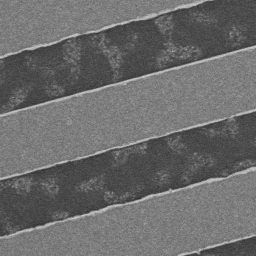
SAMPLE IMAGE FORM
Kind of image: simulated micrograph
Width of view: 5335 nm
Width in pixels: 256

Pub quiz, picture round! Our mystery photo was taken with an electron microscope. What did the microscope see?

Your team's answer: one or a few lines or trenches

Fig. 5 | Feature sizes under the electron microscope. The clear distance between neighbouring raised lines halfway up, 1170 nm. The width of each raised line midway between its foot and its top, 1290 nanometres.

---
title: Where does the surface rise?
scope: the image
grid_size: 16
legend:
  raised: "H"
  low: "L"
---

HHHHHHHHHHHLLLLL
HHHHHHHLLLLLLLLL
HHHHLLLLLLLLLLLL
LLLLLLLLLLLLLLHH
LLLLLLLLLLHHHHHH
LLLLLLHHHHHHHHHH
LLLHHHHHHHHHHHHH
HHHHHHHHHHHHHHLL
HHHHHHHHHHLLLLLL
HHHHHHLLLLLLLLLL
HHHLLLLLLLLLLLLL
LLLLLLLLLLLLHHHH
LLLLLLLLLHHHHHHH
LLLLLHHHHHHHHHHH
LHHHHHHHHHHHHHHH
HHHHHHHHHHHHHLLL